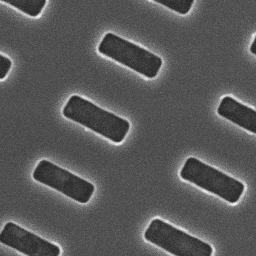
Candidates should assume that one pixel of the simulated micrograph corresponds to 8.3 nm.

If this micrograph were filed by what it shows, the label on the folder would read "holes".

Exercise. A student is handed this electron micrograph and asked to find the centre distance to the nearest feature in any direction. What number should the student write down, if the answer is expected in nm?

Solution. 593